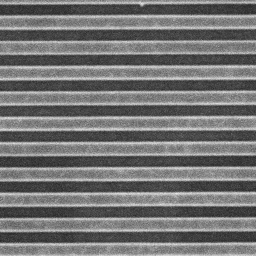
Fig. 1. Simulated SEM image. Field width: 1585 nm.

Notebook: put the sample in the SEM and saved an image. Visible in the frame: parallel lines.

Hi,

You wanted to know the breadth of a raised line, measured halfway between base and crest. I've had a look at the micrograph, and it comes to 82 nanometres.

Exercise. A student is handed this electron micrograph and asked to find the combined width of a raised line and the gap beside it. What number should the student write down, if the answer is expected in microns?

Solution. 0.157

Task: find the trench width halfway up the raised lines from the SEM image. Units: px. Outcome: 12.4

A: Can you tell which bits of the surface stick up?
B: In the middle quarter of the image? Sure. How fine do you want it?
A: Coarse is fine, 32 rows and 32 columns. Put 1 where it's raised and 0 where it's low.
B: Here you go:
00000000000000000000000000000000
11111111111111111111111111111111
11111111111111111111111111111111
11111111111111111111111111111111
00000000000000000000000000000000
00000000000000000000000000000000
00000000000000000000000000000000
11111111111111111111111111111111
11111111111111111111111111111111
11111111111111111111111111111111
00000000000000000000000000000000
00000000000000000000000000000000
00000000000000000000000000000000
11111111111111111111111111111111
11111111111111111111111111111111
11111111111111111111111111111111
11100000000000000000000000000000
00000000000000000000000000000000
00000000000000000000000000000000
00000000000000000000000000000000
11111111111111111111111111111111
11111111111111111111111111111111
11111111111111111111111111111111
00000000000000000000000000000000
00000000000000000000000000000000
00000000000000000000000000000000
11111111111111111111111111111111
11111111111111111111111111111111
11111111111111111111111111111111
00000000000000000000000000000000
00000000000000000000000000000000
00000000000000000000000000000000